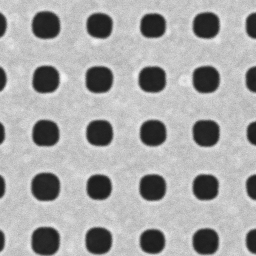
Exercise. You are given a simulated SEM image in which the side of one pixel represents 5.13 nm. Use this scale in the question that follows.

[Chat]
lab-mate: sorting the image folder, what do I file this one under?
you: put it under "a regular array of holes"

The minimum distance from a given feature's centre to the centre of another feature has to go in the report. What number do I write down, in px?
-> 53.4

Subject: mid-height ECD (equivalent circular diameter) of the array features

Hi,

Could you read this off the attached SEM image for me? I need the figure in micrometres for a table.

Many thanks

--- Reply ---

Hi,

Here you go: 0.144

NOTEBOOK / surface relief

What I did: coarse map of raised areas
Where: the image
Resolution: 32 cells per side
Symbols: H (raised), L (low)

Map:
HHHHHHHHHHHHHHHHHHHHHHHHHHHHHHHH
HHHHHLHHHHHHHHHHHHHHHHHHHHHHHHHH
LHHHLLLHHHHLLLHHHHLLLHHHLLLHHHHL
LHHHLLLLHHHLLLHHHHLLLHHHLLLHHHHL
HHHHLLLHHHHLLLHHHHLLHHHHHLLHHHHL
HHHHHHHHHHHHHHHHHHHHHHHHHHHHHHHH
HHHHHHHHHHHHHHHHHHHHHHHHHHHHHHHH
HHHHHHHHHHHHHHHHHHHHHHHHHHHHHHHH
HHHHHLLHHHHLLHHHHHLLHHHHHLLHHHHL
LHHHLLLHHHHLLLHHHLLLLHHHLLLHHHHL
LHHHLLLHHHHLLLHHHLLLLHHHLLLHHHHL
HHHHHLLHHHHLLHHHHHLLHHHHHLLHHHHH
HHHHHHHHHHHHHHHHHHHHHHHHHHHHHHHH
HHHHHHHHHHHHHHHHHHHHHHHHHHHHHHHH
HHHHHHHHHHHHHHHHHHHHHHHHHHHHHHHH
HHHHLLLHHHHLLLHHHHLLHHHHLLLHHHHL
LHHHLLLHHHHLLLHHHLLLLHHHLLLLHHHL
LHHHLLLHHHHLLLHHHHLLLHHHLLLHHHHL
HHHHHHHHHHHHHHHHHHHHHHHHHHHHHHHH
HHHHHHHHHHHHHHHHHHHHHHHHHHHHHHHH
HHHHHHHHHHHHHHHHHHHHHHHHHHHHHHHH
HHHHHHHHHHHHHHHHHHHHHHHHHHHHHHHH
LHHHLLLHHHHLLLHHHHLLLHHHLLLHHHHL
LHHHLLLLHHHLLLHHHLLLLHHHLLLHHHHL
HHHHLLLHHHHLLLHHHHLLLHHHLLLHHHHL
HHHHHHHHHHHHHHHHHHHHHHHHHHHHHHHH
HHHHHHHHHHHHHHHHHHHHHHHHHHHHHHHH
HHHHHHHHHHHHHHHHHHHHHHHHHHHHHHHH
HHHHHLLHHHHHLHHHHHHHHHHHHHHHHHHH
LHHHLLLHHHHLLLHHHHLLLHHHLLLHHHHL
LHHHLLLHHHHLLLHHHHLLLHHHLLLHHHHL
HHHHLLLHHHHLLHHHHHLLHHHHHLLHHHHL